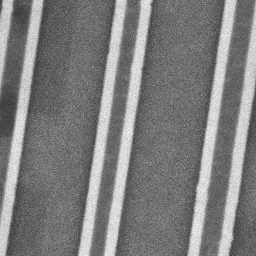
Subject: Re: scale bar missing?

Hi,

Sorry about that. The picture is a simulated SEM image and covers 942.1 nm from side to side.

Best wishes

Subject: one or a few lines or trenches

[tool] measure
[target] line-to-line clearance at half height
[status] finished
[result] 307 nm